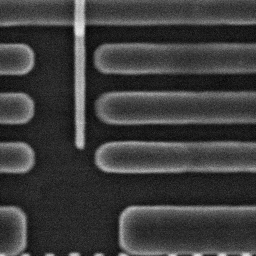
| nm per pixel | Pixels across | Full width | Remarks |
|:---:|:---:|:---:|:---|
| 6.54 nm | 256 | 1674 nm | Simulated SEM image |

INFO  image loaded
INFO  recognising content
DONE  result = wiring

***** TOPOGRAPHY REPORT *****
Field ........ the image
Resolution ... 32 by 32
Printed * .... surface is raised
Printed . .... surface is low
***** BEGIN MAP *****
********************************
********************************
********************************
.........**.....................
.........**.....................
................................
****........********************
****........********************
****........********************
................................
................................
................................
****........********************
****........********************
****........********************
................................
................................
................................
****.........*******************
****........********************
****........********************
.**...........******............
................................
................................
................................
................................
***............*****************
***............*****************
***............*****************
***............*****************
***............*****************
***............*****************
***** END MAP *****